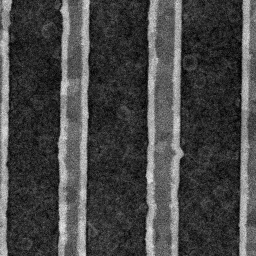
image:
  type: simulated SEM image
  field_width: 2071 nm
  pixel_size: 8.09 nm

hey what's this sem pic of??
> one or a few lines or trenches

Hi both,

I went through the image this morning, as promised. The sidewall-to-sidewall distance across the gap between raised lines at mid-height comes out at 538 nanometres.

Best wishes